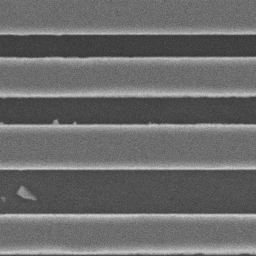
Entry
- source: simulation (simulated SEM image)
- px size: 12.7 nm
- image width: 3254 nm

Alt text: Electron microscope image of lines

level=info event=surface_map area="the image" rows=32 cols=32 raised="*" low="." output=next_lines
********************************
********************************
********************************
********************************
................................
................................
................................
********************************
********************************
********************************
********************************
********************************
................................
................................
................................
................................
********************************
********************************
********************************
********************************
********************************
................................
................................
................................
................................
................................
................................
********************************
********************************
********************************
********************************
********************************